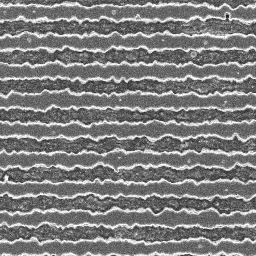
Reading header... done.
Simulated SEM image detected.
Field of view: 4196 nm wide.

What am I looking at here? parallel lines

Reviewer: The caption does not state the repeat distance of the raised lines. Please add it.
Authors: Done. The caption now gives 482 nanometres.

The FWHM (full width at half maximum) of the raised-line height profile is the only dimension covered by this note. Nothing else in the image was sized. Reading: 14.9 pixels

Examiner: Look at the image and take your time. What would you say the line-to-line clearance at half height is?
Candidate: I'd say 0.227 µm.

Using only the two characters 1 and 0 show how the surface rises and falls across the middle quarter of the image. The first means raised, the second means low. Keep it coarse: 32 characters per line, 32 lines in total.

11111111111111111111111111111111
11111111111111111111111111111111
11111111111111111111111111111111
11111111111111111111001111111110
00000100000000000000000000000000
00000000000000000000000000000000
10000000000000000000000000000000
11111111010010011111111001110001
11111111111111111111111111111111
11111111111111111111111111111111
11111111111111111111111111111111
00000000000000000101100000001000
00000000000000000000000000000000
00000000000000000000000000000000
00110000011010010001011110110100
11111111111111111111111111111111
11111111111111111111111111111111
11111111111111111111111111111111
11100001100001110000011100001110
00000000000000000000000000000000
00000000000000000000000000000000
00000000000001100000000000000000
11111111101111111111111111111111
11111111111111111111111111111111
11111111111111111111111111111111
11111111000111111100111101111111
00000000000011000000000000000000
00000000000000000000000000000000
00000000000000000000000000000000
10100111111111111100011111000111
11111111111111111111111111111111
11111111111111111111111111111111